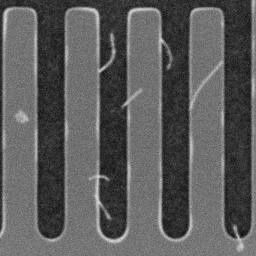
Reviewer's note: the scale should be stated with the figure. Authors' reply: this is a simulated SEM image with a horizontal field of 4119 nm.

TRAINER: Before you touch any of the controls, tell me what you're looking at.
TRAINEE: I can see groups of lines, slits or small figures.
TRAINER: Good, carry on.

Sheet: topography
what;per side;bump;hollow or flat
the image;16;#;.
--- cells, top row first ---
................
##..##..##..##..
##..##..##..##..
##..##..##..##..
##..##..##..##..
##..##..##..##..
##..##..##..##..
##..##..##..##..
##..##..##..##..
##..##..##..##..
##..##..##..##..
##..##..##..##..
##..##..##..##..
##..##..##..##..
###.##..##..##..
################